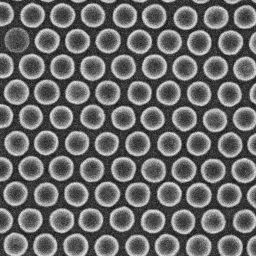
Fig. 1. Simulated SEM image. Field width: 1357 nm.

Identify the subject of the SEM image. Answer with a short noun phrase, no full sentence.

a regular array of raised bodies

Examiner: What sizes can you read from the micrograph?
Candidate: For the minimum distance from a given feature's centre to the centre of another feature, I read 0.154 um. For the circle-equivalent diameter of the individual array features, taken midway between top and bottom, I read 125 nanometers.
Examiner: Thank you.